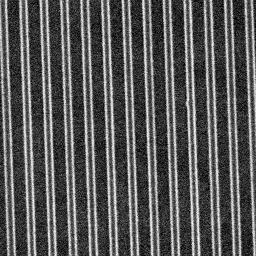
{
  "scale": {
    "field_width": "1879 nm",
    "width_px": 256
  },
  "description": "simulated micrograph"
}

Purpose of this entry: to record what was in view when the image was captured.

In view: parallel lines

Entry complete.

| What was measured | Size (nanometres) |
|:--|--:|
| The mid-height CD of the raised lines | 50.4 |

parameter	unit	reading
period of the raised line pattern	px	20.5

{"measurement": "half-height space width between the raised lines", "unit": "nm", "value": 101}